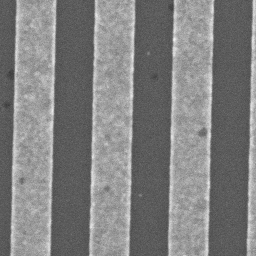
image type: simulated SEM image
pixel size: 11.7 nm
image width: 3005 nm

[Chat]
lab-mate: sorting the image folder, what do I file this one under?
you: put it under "wiring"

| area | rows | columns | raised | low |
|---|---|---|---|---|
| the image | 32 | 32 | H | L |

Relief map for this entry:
LLHHHHHLLLLLHHHHHLLLLLHHHHHLLLLL
LLHHHHHLLLLLHHHHHLLLLLHHHHHLLLLL
LLHHHHHLLLLLHHHHHLLLLLHHHHHLLLLL
LLHHHHHLLLLLHHHHHLLLLLHHHHHLLLLL
LLHHHHHLLLLLHHHHHLLLLLHHHHHLLLLL
LLHHHHHLLLLLHHHHHLLLLLHHHHLLLLLL
LLHHHHHLLLLLHHHHHLLLLLHHHHLLLLLL
LLHHHHHLLLLLHHHHHLLLLLHHHHLLLLLL
LLHHHHHLLLLLHHHHHLLLLLHHHHLLLLLL
LLHHHHHLLLLLHHHHHLLLLLHHHHLLLLLL
LLHHHHHLLLLLHHHHHLLLLLHHHHLLLLLL
LLHHHHHLLLLLHHHHLLLLLLHHHHLLLLLH
LLHHHHHLLLLLHHHHLLLLLLHHHHLLLLLH
LLHHHHHLLLLLHHHHLLLLLLHHHHLLLLLH
LLHHHHHLLLLLHHHHLLLLLLHHHHLLLLLH
LLHHHHHLLLLLHHHHLLLLLLHHHHLLLLLH
LLHHHHHLLLLLHHHHLLLLLLHHHHLLLLLH
LLHHHHHLLLLLHHHHLLLLLHHHHHLLLLLH
LLHHHHLLLLLLHHHHLLLLLHHHHHLLLLLH
LLHHHHLLLLLLHHHHLLLLLHHHHHLLLLLH
LLHHHHLLLLLLHHHHLLLLLHHHHHLLLLLH
LLHHHHLLLLLLHHHHLLLLLHHHHHLLLLLH
LLHHHHLLLLLLHHHHLLLLLHHHHHLLLLLH
LLHHHHLLLLLLHHHHLLLLLHHHHHLLLLLH
LLHHHHLLLLLHHHHHLLLLLHHHHHLLLLLH
LLHHHHLLLLLHHHHHLLLLLHHHHHLLLLLH
LLHHHHLLLLLHHHHHLLLLLHHHHHLLLLLH
LLHHHHLLLLLHHHHHLLLLLHHHHHLLLLLH
LLHHHHLLLLLHHHHHLLLLLHHHHHLLLLLH
LLHHHHLLLLLHHHHHLLLLLHHHHHLLLLLH
LHHHHHLLLLLHHHHHLLLLLHHHHHLLLLLH
LHHHHHLLLLLHHHHHLLLLLHHHHHLLLLLH